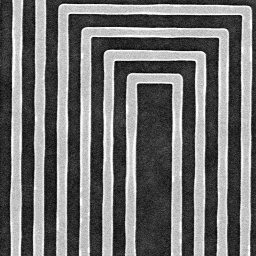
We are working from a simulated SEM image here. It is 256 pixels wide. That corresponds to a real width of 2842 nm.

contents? groups of lines, slits or small figures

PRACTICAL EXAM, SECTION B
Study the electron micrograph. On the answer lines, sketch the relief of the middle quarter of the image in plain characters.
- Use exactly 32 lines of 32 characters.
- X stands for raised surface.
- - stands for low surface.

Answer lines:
X---XXX---XX--------------------
X---XXX---XX--------------------
X---XXX---XX----XXXXXXXXXXX-----
X---XXX---XX----XXXXXXXXXXXXX---
X---XXX---XX----XXXXXXXXXXXXX---
X---XX----XX----XX---------XX---
X---XX----XX----XX---------XX---
X---XX----XX----XX---------XX---
X---XX----XX----XX---------XX---
X---XX----XX----XX---------XX---
X---XX----XX----XX---------XX---
X---XX----XX----XX---------XX---
X---XX----XX----XX---------XX---
X---XX----XX----XX---------XX---
X---XX----XX----XX---------XX---
X---XX----XX----XX----------X---
X---XX----XX----XX---------XX---
X---XX----XX----XX---------XX---
X---XX----XX----XX---------XX---
X---XX----XX----XX---------XX---
X---XX----XX----X----------XX---
X---XX----XX----X----------XX---
X---XX----XX----X----------XX---
X---XX----XX----X----------XX---
X---XX----XX----X----------XX---
X---XX----XX----X----------XX---
X---XX----XX----X----------XX---
X---XX----XX----X----------XX---
----XX----XX----X----------XX---
----XX----XX----XX---------XX---
----XX----XX----XX---------XX---
----XX----XX----XX---------XX---